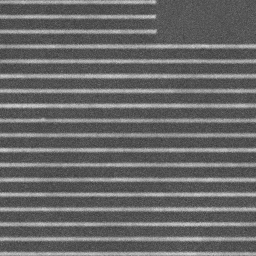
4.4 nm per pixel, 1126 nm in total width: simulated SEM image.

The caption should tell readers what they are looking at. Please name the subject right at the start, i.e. parallel lines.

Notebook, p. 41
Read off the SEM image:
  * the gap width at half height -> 52.2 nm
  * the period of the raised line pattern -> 14.8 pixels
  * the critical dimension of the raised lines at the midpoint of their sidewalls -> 13.2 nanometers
